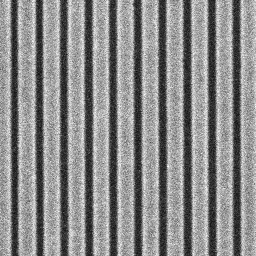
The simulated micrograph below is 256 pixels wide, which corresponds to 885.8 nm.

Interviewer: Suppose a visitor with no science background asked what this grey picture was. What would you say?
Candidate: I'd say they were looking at parallel lines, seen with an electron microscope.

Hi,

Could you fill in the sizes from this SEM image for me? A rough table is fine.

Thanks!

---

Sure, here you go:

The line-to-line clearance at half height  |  8.87 px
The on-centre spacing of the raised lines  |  85.5 nanometres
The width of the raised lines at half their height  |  54.1 nanometers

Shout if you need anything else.